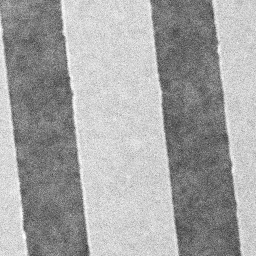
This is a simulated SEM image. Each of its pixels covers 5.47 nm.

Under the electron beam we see one or a few lines or trenches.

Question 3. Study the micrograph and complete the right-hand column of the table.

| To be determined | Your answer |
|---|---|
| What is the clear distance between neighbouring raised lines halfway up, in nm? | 347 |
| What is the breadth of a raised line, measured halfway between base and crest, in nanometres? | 476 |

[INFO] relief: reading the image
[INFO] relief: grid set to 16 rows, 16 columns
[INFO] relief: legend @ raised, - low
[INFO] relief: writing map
----@@@@@----@@@
----@@@@@----@@@
----@@@@@@----@@
----@@@@@@----@@
----@@@@@@----@@
-----@@@@@----@@
@----@@@@@----@@
@----@@@@@----@@
@----@@@@@----@@
@----@@@@@----@@
@----@@@@@@----@
@----@@@@@@----@
@----@@@@@@----@
@----@@@@@@----@
@----@@@@@@----@
@@----@@@@@----@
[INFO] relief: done